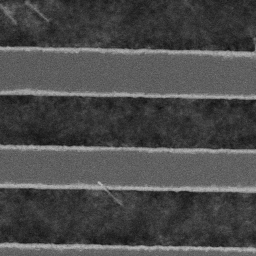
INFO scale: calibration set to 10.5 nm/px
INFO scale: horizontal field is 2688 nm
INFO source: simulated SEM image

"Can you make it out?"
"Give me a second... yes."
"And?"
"lines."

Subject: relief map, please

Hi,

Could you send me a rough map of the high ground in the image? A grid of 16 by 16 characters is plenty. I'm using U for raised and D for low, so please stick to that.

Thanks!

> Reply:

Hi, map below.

DDDDDDDDDDDDDDDD
DDDDDDDDDDDDDDDD
DDDDDDDDDDDDDDDD
UUUUUUUUUUUUUUUU
UUUUUUUUUUUUUUUU
UUUUUUUUUUUUUUUU
DDDDDDDDDDDDDDDD
DDDDDDDDDDDDDDDD
DDDDDDDDDDDDDDDD
UUUUUUUUUUUUUUUU
UUUUUUUUUUUUUUUU
UUUUUUUUUUUUUUUU
DDDDDDDDDDDDDDDD
DDDDDDDDDDDDDDDD
DDDDDDDDDDDDDDDD
UUUUUUUUUUUUUUUU